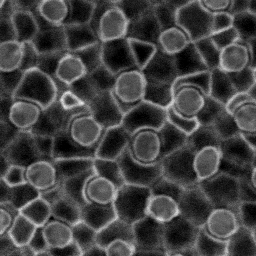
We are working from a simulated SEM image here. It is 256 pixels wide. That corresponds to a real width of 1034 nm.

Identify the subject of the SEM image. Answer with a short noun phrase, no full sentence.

a regular array of raised bodies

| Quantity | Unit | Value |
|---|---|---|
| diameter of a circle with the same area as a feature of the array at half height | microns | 0.108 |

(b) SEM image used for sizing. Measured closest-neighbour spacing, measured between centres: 27.2 px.